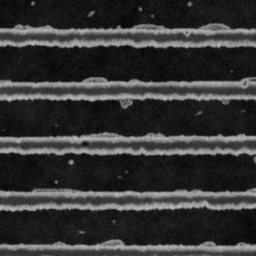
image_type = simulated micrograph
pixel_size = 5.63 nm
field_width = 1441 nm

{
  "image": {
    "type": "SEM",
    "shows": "lines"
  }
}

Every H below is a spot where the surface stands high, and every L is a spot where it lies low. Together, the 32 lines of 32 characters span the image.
LLLLLLLLLLLLLLLLLLLLLLLLLLLLLLLL
LLLLLLLLLLLLLLLLLLLLLLLLLLLLLLLL
LLLLLLLLLLLLLLLLLLLLLLLLLLLLLLLL
LLLLLLLLLLLLLLLLLLLLLLLLLLLLLLLL
HHHHHHHHHHHHHHHHHHHHHHHHHHHHHHHH
HHHLLHHHHHHHLHHLHHHHHHHHHHHHHHHH
LLLLLLLLLLLLLLLLLLLLLLLLLLLLLLLL
LLLLLLLLLLLLLLLLLLLLLLLLLLLLLLLL
LLLLLLLLLLLLLLLLLLLLLLLLLLLLLLLL
LLLLLLLLLLLLLLLLLLLLLLLLLLLLLLLL
HHHHHHHHHHHHHHHHHHHHHHHHHHHHHHHH
HHHHHHHHHHHHHHHHHHHHHHHHHHHHHHHH
LLLLLLLLLLLLLLLLLLLLLLLLLLLLLLLL
LLLLLLLLLLLLLLLLLLLLLLLLLLLLLLLL
LLLLLLLLLLLLLLLLLLLLLLLLLLLLLLLL
LLLLLLLLLLLLLLLLLLLLLLLLLLLLLLLL
LLLLLLLLLLLLLLLLLLLLLLLLLLLLLLLL
HHHHHHHHHHHHHHHHHHHHHHHHHHHHHHHH
HHHHHHHHHHHHHHHHHHHHHHHHHHHHHHHH
LLLLLLLLLLLLLLLLLLLLLLLLLLLLLLLL
LLLLLLLLLLLLLLLLLLLLLLLLLLLLLLLL
LLLLLLLLLLLLLLLLLLLLLLLLLLLLLLLL
LLLLLLLLLLLLLLLLLLLLLLLLLLLLLLLL
LLLLLLLLLLLLLLLLLLLLLLLLLLLLLLLL
HHHHHHHHHHHHHHHHHHHHHHHHHHHHHHHH
HHHHHHHHHHHHHHHHHHHHHHHHHHHHHHHH
LLLLLLLLLLLLLLLLLLLLLLLLLLLLLLLL
LLLLLLLLLLLLLLLLLLLLLLLLLLLLLLLL
LLLLLLLLLLLLLLLLLLLLLLLLLLLLLLLL
LLLLLLLLLLLLLLLLLLLLLLLLLLLLLLLL
LLLLLLLLLLLLLLLLLLLLLLLLLLLLLLLL
HHHHHHHHHHHHHHHHHHHHHHHHHHHHHHHH